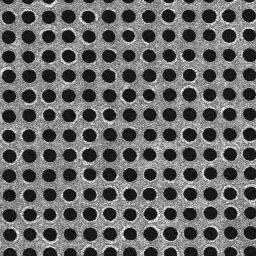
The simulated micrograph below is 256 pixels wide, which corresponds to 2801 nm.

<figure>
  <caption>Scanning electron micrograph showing a regular array of holes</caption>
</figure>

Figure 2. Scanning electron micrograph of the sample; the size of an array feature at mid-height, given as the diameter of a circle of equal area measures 147 nm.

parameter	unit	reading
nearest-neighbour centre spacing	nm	213